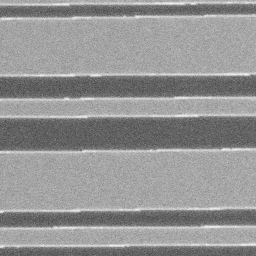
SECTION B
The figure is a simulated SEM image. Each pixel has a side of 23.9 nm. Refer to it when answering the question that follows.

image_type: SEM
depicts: lines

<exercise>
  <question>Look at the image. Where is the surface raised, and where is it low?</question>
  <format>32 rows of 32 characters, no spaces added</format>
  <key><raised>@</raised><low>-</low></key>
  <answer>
@@@@@@@@@-----------------------
--------------------------------
@@@@@@@@@@@@@@@@@@@@@@@@@@@@@@@@
@@@@@@@@@@@@@@@@@@@@@@@@@@@@@@@@
@@@@@@@@@@@@@@@@@@@@@@@@@@@@@@@@
@@@@@@@@@@@@@@@@@@@@@@@@@@@@@@@@
@@@@@@@@@@@@@@@@@@@@@@@@@@@@@@@@
@@@@@@@@@@@@@@@@@@@@@@@@@@@@@@@@
@@@@@@@@@@@@@@@@@@@@@@@@@@@@@@@@
--------------------------------
--------------------------------
--------------------------------
@@@@@@@@@@@@@@@@@@@@@@@@@@@@@@@@
@@@@@@@@@@@@@@@@@@@@@@@@@@@@@@@@
@@@@@@@@@@@@@@@@@@@@@@@-@-------
--------------------------------
--------------------------------
--------------------------------
--------------------------------
@@@@@@@@@@@@@@@@@@@@@@@@@@@@@@@@
@@@@@@@@@@@@@@@@@@@@@@@@@@@@@@@@
@@@@@@@@@@@@@@@@@@@@@@@@@@@@@@@@
@@@@@@@@@@@@@@@@@@@@@@@@@@@@@@@@
@@@@@@@@@@@@@@@@@@@@@@@@@@@@@@@@
@@@@@@@@@@@@@@@@@@@@@@@@@@@@@@@@
@@@@@@@@@@@@@@@@@@@@@@@@@@@@@@@@
--------------------------------
--------------------------------
-------@@@@@@@@@@@@@@@@@@@@@@@@@
@@@@@@@@@@@@@@@@@@@@@@@@@@@@@@@@
@@@@@@@@@@@@@@@@@@@@@@@@@@@@@@@@
--------------------------------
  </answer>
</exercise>